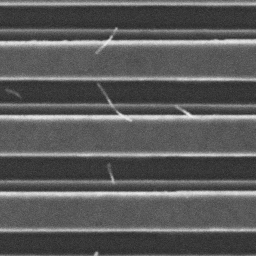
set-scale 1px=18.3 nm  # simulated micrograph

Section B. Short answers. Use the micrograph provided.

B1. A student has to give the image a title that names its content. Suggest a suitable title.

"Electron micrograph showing lines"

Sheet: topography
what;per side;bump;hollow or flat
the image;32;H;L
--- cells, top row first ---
LLLLLLLLLLLLLLLLLLLLLLLLLLLLLLLL
LLLLLLLLLLLLLLLLLLLLLLLLLLLLLLLL
LLLLLLLLLLLLLLLLLLLLLLLLLLLLLLLL
LLLLLLLLLLLLLLLLLLLLLLLLLLLLLLLL
LLLLLLLLLLLLLLLLLLLLLLLLLLLLLLLL
HHHHHHHHHHHHHHHHHHHHHHHHHHHHHHHH
HHHHHHHHHHHHHHHHHHHHHHHHHHHHHHHH
HHHHHHHHHHHHHHHHHHHHHHHHHHHHHHHH
HHHHHHHHHHHHHHHHHHHHHHHHHHHHHHHH
HHHHHHHHHHHHHHHHHHHHHHHHHHHHHHHH
LLLLLLLLLLLLLLLLLLLLLLLLLLLLLLLL
LLLLLLLLLLLLLLLLLLLLLLLLLLLLLLLL
LLLLLLLLLLLLLLLLLLLLLLLLLLLLLLLL
LLLLLLLLLLLLLLLLLLLLLLLLLLLLLLLL
HHHHHHHHHHHHHHHHHHHHHHHHHHHHHHHH
HHHHHHHHHHHHHHHHHHHHHHHHHHHHHHHH
HHHHHHHHHHHHHHHHHHHHHHHHHHHHHHHH
HHHHHHHHHHHHHHHHHHHHHHHHHHHHHHHH
HHHHHHHHHHHHHHHHHHHHHHHHHHHHHHHH
LLLLLLLLLLLLLLLLLLLLLLLLLLLLLLLL
LLLLLLLLLLLLLLLLLLLLLLLLLLLLLLLL
LLLLLLLLLLLLLLLLLLLLLLLLLLLLLLLL
LLLLLLLLLLLLLLLLLLLLLLLLLLLLLLLL
LLLLLLLLLLLLLLLLLLLLLLLLLLLLLLLL
HHHHHHHHHHHHHHHHHHHHHHHHHHHHHHHH
HHHHHHHHHHHHHHHHHHHHHHHHHHHHHHHH
HHHHHHHHHHHHHHHHHHHHHHHHHHHHHHHH
HHHHHHHHHHHHHHHHHHHHHHHHHHHHHHHH
HHHHHHHHHHHHHHHHHHHHHHHHHHHHHHHH
LLLLLLLLLLLLLLLLLLLLLLLLLLLLLLLL
LLLLLLLLLLLLLLLLLLLLLLLLLLLLLLLL
LLLLLLLLLLLLLLLLLLLLLLLLLLLLLLLL